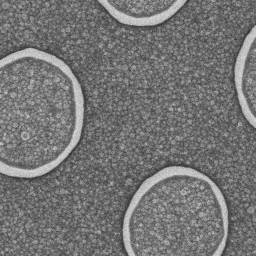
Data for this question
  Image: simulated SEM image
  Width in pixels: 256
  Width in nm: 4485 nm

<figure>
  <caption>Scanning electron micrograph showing raised bodies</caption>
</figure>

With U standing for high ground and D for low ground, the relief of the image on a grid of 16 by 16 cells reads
DDDDDDDUUUUDDDDD
DDDDDDDDDDDDDDDD
DDDDDDDDDDDDDDDD
DUUDDDDDDDDDDDDU
UUUUDDDDDDDDDDDU
UUUUUDDDDDDDDDDU
UUUUUDDDDDDDDDDU
UUUUUDDDDDDDDDDD
UUUUUDDDDDDDDDDD
UUUUDDDDDDDDDDDD
UUUDDDDDDDDDDDDD
DDDDDDDDDUUUUDDD
DDDDDDDDUUUUUUDD
DDDDDDDDUUUUUUDD
DDDDDDDDUUUUUUDD
DDDDDDDDUUUUUUDD